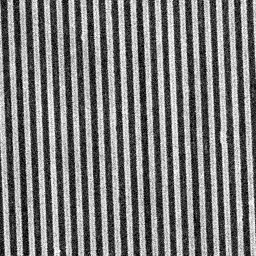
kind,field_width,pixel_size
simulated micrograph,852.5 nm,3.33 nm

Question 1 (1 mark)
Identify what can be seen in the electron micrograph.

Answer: parallel lines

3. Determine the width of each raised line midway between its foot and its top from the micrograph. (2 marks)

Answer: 16.6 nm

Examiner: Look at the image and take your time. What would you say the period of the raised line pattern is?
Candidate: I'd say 40.8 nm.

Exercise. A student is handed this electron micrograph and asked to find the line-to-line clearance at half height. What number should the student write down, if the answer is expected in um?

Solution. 0.0233